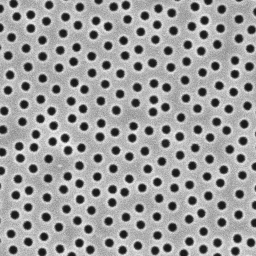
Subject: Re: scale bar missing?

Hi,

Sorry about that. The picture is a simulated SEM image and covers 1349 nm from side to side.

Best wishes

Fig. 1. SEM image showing a regular array of holes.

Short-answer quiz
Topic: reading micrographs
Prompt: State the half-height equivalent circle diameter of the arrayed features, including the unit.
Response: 0.0468 micrometres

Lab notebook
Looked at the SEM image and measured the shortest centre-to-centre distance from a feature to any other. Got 0.0816 microns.